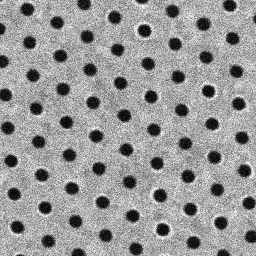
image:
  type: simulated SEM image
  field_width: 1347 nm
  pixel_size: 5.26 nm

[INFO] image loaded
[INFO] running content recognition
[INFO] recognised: a regular array of holes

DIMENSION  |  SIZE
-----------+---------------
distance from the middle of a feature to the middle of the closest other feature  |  172 nanometres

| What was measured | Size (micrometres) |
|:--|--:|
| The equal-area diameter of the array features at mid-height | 0.0707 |